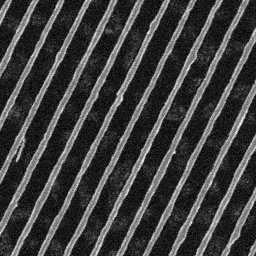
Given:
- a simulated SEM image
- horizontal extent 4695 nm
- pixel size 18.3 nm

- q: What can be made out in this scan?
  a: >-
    parallel lines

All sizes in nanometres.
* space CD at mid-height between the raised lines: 335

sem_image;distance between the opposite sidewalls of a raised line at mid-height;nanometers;88.3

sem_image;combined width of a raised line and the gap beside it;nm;432